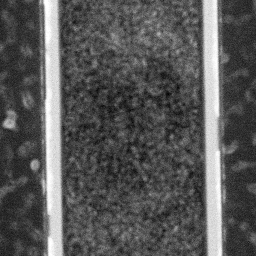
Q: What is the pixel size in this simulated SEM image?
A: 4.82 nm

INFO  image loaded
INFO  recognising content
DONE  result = one or a few lines or trenches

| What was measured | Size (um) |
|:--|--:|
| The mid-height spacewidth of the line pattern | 0.748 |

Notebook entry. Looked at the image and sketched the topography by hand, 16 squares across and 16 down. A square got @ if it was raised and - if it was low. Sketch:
@@@----------@@@
@@@----------@@@
@@@----------@@@
@@@----------@@@
@@@----------@@@
@@@----------@@@
@@@----------@@@
@@@----------@@@
@@@----------@@@
@@@----------@@@
@@@----------@@@
@@@----------@@@
@@@@---------@@@
@@@@---------@@@
@@@@---------@@@
@@@@---------@@@